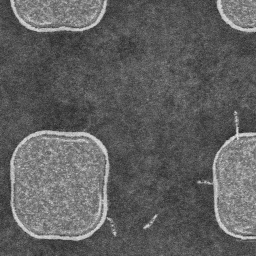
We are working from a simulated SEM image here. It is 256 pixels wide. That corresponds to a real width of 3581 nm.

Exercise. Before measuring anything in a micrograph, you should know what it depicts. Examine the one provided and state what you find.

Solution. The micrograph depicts raised bodies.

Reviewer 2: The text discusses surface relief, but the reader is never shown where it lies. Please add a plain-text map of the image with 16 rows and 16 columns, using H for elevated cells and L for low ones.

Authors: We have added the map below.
LHHHHHLLLLLLLLHH
LLHHHHLLLLLLLLHH
LLLLLLLLLLLLLLLL
LLLLLLLLLLLLLLLL
LLLLLLLLLLLLLLLL
LLLLLLLLLLLLLLLL
LLLLLLLLLLLLLLLL
LLLLLLLLLLLLLLLL
LLHHHHLLLLLLLLLH
LHHHHHHLLLLLLLHH
LHHHHHHLLLLLLHHH
LHHHHHHLLLLLLHHH
LHHHHHHLLLLLLHHH
LHHHHHLLLLLLLLHH
LLHHHHLLLLLLLLHH
LLLLLLLLLLLLLLLL